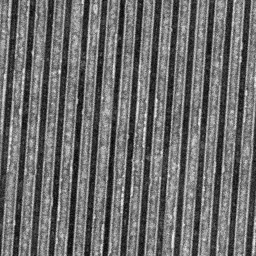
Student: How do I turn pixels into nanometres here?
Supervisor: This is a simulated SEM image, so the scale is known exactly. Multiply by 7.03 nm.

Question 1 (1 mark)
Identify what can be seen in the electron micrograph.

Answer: parallel lines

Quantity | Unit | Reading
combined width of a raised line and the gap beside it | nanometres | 126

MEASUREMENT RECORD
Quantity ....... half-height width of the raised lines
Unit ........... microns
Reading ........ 0.0815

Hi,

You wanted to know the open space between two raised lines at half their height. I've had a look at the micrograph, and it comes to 47.3 nm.